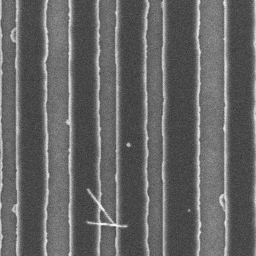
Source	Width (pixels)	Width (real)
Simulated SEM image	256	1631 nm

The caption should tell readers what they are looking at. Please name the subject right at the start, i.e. lines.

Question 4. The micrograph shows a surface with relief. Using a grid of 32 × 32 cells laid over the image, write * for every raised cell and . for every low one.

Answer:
..****...***...****.*****...****
..****...***..****..*****...****
..****...***...***..*****...****
..****...***..****..*****...****
..****...***..****..*****...****
..****...***..****..*****...****
..****...***..****..*****...****
..****...***..****..*****...****
..****...***...***..*****...****
..****...***...***..*****...****
..****...***...***..*****...****
..****...***...***..*****...****
..****...***...***..*****...****
..****...***...***..*****...****
..****...***...***..*****...****
..****...***...***..*****...****
..****...****..***..*****...****
..****...****..***..*****...****
..****...****.****..*****...****
..****...****..***..*****...****
..****...****..***..*****...****
..****...***..****..*****...****
..****...****.****..*****...****
..****...****..***..*****...****
..****...****..***..*****...****
..****...****..****.*****...****
..****...****..***..*****...****
..****...****..***..*****...****
..****...****.****..*****...****
..****...****.****..*****...****
..****...****.****..*****...****
..****...***...****.*****...****